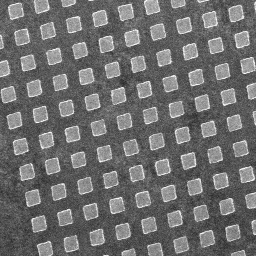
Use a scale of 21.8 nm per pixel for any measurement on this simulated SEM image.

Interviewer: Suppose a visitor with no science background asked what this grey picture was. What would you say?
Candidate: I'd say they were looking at a regular array of raised bodies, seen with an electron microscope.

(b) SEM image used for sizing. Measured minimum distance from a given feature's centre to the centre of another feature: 0.575 um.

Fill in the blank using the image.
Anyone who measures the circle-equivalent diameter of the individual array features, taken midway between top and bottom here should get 0.335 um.